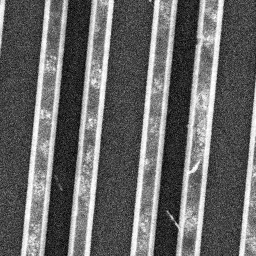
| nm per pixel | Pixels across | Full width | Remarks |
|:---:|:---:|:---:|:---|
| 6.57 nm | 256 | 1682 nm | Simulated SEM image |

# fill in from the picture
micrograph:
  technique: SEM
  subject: parallel lines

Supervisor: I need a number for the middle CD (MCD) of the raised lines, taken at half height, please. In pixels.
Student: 18.1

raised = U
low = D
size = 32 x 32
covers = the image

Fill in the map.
DDDDDDUUDDDDUUDDDDDDUUDDDUUUDDDD
DDDDDDUUDDDDUUDDDDDDUUDDDUUUDDDD
DDDDDDUUDDDDUUDDDDDUUUDDDUUUDDDD
DDDDDDUUDDDUUUDDDDDUUUDDDUUDDDDD
DDDDDDUUDDDUUUDDDDDUUDDDDUUDDDDD
DDDDDUUUDDDUUDDDDDDUUDDDDUUDDDDD
DDDDDUUUDDDUUDDDDDDUUDDDDUUDDDDD
DDDDDUUUDDDUUDDDDDDUUDDDDUUDDDDD
DDDDDUUDDDDUUDDDDDDUUDDDDUUDDDDD
DDDDDUUDDDDUUDDDDDDUUDDDUUUDDDDD
DDDDDUUDDDDUUDDDDDDUUDDDUUUDDDDD
DDDDDUUDDDDUUDDDDDDUUDDDUUUDDDDD
DDDDDUUDDDDUUDDDDDUUUDDDUUUDDDDD
DDDDDUUDDDDUUDDDDDUUUDDDUUDDDDDD
DDDDDUUDDDUUUDDDDDUUDDDDUUDDDDDD
DDDDUUUDDDUUUDDDDDUUDDDDUUDDDDDD
DDDDUUUDDDUUDDDDDDUUDDDDUUDDDDDD
DDDDUUUDDDUUDDDDDDUUDDDDUUDDDDDD
DDDDUUDDDDUUDDDDDDUUDDDDUUDDDDDU
DDDDUUDDDDUUDDDDDDUUDDDUUUDDDDDU
DDDDUUDDDDUUDDDDDDUUDDDUUUDDDDDU
DDDDUUDDDDUUDDDDDDUUDDDUUUDDDDDU
DDDDUUDDDDUUDDDDDDUUDDDUUUDDDDDU
DDDDUUDDDDUUDDDDDUUUDDDUUDDDDDDU
DDDDUUDDDUUUDDDDDUUUDDDUUDDDDDDU
DDDDUUDDDUUUDDDDDUUDDDDUUDDDDDDU
DDDUUUDDDUUDDDDDDUUDDDDUUDDDDDDU
DDDUUUDDDUUDDDDDDUUDDDDUUDDDDDDU
DDDUUUDDDUUDDDDDDUUDDDUUUDDDDDUU
DDDUUDDDDUUDDDDDDUUDDDDUUDDDDDUU
DDDUUDDDDUUDDDDDDUUDDDUUUDDDDDUU
DDDUUDDDDUUDDDDDDUUDDDUUUDDDDDUU